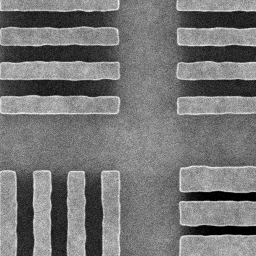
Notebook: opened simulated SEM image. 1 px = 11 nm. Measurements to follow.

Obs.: groups of lines, slits or small figures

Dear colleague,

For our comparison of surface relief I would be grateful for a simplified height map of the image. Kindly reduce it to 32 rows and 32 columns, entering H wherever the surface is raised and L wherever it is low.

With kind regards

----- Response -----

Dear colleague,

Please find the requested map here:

HHHHHHHHHHHHHHHLLLLLLLHHHHHHHHHH
LLLLLLLLLLLLLLLLLLLLLLLLLLLLLLLL
LLLLLLLLLLLLLLLLLLLLLLLLLLLLLLLL
LHHLLHHLLHHHHHLLLLLLLLLLLLLLLLLL
HHHHHHHHHHHHHHHLLLLLLLHHHHHHHHHH
HHHHHHHHHHHHHHLLLLLLLLLHHHHHHHHH
LLLLLLLLLLLLLLLLLLLLLLLLLLLLLLLL
LLLLLLLLLLLLLLLLLLLLLLLLLLLLLLLL
HHHHHHHHHHHHHHHLLLLLLLHHHHHHHHHH
HHHHHHHHHHHHHHHLLLLLLLHHHHHHHHHH
LLLLLLLLLLLLLLLLLLLLLLLLLLLLLLLL
LLLLLLLLLLLLLLLLLLLLLLLLLLLLLLLL
HHHHHHHHHHHHHHHLLLLLLLHHHHHHHHHH
HHHHHHHHHHHHHHHLLLLLLLHHHHHHHHHH
LLLLLLLLLLLLLLLLLLLLLLLLLLLLLLLL
LLLLLLLLLLLLLLLLLLLLLLLLLLLLLLLL
LLLLLLLLLLLLLLLLLLLLLLLLLLLLLLLL
LLLLLLLLLLLLLLLLLLLLLLLLLLLLLLLL
LLLLLLLLLLLLLLLLLLLLLLLLLLLLLLLL
LLLLLLLLLLLLLLLLLLLLLLLLLLLLLLLL
LLLLLLLLLLLLLLLLLLLLLLLLLLLLLLLL
HHLLLHLLLHLLLHHLLLLLLLLHHHHHHHHH
HHLLHHLLHHHLLHHLLLLLLLLHHHHHHHHH
HHLLHHLLHHHLLHHLLLLLLLLHHHHHHHHH
HHLLHHLLHHHLLHHLLLLLLLLLLLLLLLLL
HHLLHHLLHHHLLHHLLLLLLLLHHHHHHHHH
HHLLHHLLHHHLLHHLLLLLLLLHHHHHHHHH
HHLLHHLLHHHLLHHLLLLLLLLHHHHHHHHH
HHLLHHLLHHHLLHHLLLLLLLLLLLLLLLLL
HHLLHHLLHHHLLHHLLLLLLLLHHHHHHHHH
HHLLHHLLHHHLLHHLLLLLLLLHHHHHHHHH
HHLLHHLLHHHLLHHLLLLLLLLHHHHHHHHH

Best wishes